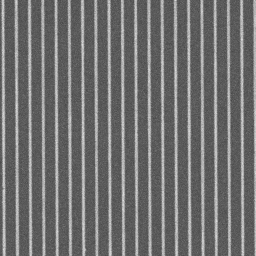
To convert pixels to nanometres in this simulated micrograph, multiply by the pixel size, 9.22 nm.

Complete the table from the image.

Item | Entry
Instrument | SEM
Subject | parallel lines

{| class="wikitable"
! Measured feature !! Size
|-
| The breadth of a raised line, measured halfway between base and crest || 17.3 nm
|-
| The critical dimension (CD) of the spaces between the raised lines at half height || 0.101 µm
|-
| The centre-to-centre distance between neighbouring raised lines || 122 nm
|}